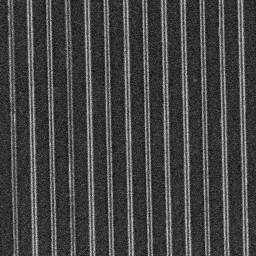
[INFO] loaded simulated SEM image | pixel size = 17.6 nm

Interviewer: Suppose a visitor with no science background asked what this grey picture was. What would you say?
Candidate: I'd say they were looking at parallel lines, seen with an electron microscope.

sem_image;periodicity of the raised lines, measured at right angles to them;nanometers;337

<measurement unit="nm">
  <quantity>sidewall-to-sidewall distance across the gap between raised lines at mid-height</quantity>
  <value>266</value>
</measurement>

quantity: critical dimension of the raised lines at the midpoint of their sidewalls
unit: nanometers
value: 66